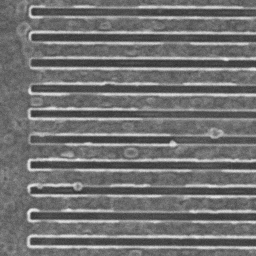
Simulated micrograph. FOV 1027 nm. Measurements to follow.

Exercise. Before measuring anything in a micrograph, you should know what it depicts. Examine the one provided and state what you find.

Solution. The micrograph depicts parallel lines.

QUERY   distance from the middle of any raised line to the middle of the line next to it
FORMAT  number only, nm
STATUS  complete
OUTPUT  102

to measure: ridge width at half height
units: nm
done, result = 68.7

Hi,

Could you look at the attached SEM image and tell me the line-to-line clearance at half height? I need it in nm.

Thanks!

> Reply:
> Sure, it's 34.1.